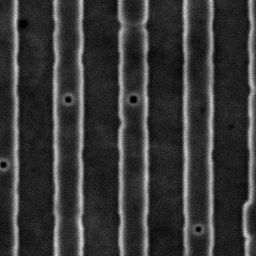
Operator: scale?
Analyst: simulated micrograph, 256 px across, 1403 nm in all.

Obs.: wiring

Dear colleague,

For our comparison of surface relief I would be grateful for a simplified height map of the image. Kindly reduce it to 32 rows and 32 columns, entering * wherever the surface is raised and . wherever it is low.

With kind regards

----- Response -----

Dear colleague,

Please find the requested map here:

**.....***.....***.....****....*
**.....***.....***.....****....*
**.....***.....***.....****....*
**.....***.....***.....***.....*
**.....***.....***.....****....*
**.....***.....***.....****....*
**.....***.....***.....****....*
**.....***.....***.....***.....*
**.....***.....***.....****....*
**.....***.....***.....***.....*
**.....***.....***.....***.....*
**.....***.....***.....***.....*
**.....***.....*.*.....****....*
**.....***.....***.....****....*
**.....***.....***.....****....*
**.....***.....***.....***.....*
**.....***.....***.....****....*
**.....***.....***.....****....*
**.....***.....***.....***.....*
**.....***.....***.....***.....*
.*.....***.....***.....***.....*
**.....***.....***.....***.....*
**.....***.....***.....****....*
**.....***.....***.....***.....*
**.....***.....***.....****....*
**.....***.....***.....****....*
**.....***.....***.....****....*
**.....***.....***.....***.....*
**.....***.....***.....****....*
**.....***.....***.....****....*
**.....***.....***.....****....*
**.....***.....***.....***.....*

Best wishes